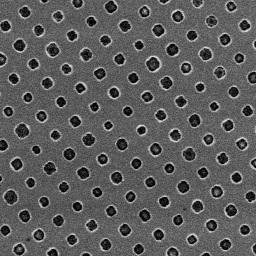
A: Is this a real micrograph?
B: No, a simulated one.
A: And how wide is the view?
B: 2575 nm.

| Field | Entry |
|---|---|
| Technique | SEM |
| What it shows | a regular array of holes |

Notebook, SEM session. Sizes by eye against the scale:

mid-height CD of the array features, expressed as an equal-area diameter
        111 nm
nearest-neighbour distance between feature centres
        235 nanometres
